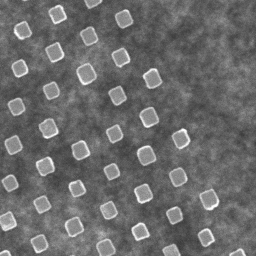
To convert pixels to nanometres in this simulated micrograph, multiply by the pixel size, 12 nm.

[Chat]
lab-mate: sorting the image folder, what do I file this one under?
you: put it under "a regular array of raised bodies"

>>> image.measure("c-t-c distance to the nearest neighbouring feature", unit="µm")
0.456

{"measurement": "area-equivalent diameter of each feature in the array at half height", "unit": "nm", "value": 200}